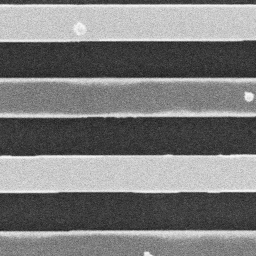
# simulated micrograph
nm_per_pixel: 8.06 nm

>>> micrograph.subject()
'lines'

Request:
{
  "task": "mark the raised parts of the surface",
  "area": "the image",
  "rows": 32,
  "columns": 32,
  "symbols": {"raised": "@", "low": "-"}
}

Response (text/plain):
--------------------------------
@@@@@@@@@@@@@@@@@@@@@@@@@@@@@@@@
@@@@@@@@@@@@@@@@@@@@@@@@@@@@@@@@
@@@@@@@@@@@@@@@@@@@@@@@@@@@@@@@@
@@@@@@@@@@@@@@@@@@@@@@@@@@@@@@@@
--------------------------------
--------------------------------
--------------------------------
--------------------------------
--------------------------------
@@@@@@@@@@@@@@@@@@@@@@@@@@@@@@@@
@@@@@@@@@@@@@@@@@@@@@@@@@@@@@@@@
@@@@@@@@@@@@@@@@@@@@@@@@@@@@@@@@
@@@@@@@@@@@@@@@@@@@@@@@@@@@@@@@@
@@@@@@@@@@@@@@@@@@@@@-----------
--------------------------------
--------------------------------
--------------------------------
--------------------------------
--------------------------------
@@@@@@@@@@@@@@@@@@@@@@@@@@@@@@@@
@@@@@@@@@@@@@@@@@@@@@@@@@@@@@@@@
@@@@@@@@@@@@@@@@@@@@@@@@@@@@@@@@
@@@@@@@@@@@@@@@@@@@@@@@@@@@@@@@@
--------------------------------
--------------------------------
--------------------------------
--------------------------------
--------------------------------
@@@@@@@@@@@@@@@@@@@@@@@@@@@@@@@@
@@@@@@@@@@@@@@@@@@@@@@@@@@@@@@@@
@@@@@@@@@@@@@@@@@@@@@@@@@@@@@@@@